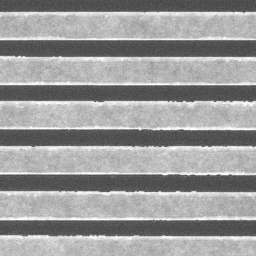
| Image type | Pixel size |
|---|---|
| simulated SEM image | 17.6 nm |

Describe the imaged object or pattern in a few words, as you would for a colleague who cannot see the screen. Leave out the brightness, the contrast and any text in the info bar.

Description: lines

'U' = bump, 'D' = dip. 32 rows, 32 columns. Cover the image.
DDDDDDDDDDDDDDDDDDDDDDDDDDDDDDDD
DDDDDDDDDDDDDDDDDDDDDDDDDDDDDDDD
UUUUUUUUUUUUUUUUUUUUUUUUUUUUUUUU
UUUUUUUUUUUUUUUUUUUUUUUUUUUUUUUU
UUUUUUUUUUUUUUUUUUUUUUUUUUUUUUUU
DDDDDDDDDDDDDDDDDDDDDDDDDDDDDDDD
DDDDDDDDDDDDDDDDDDDDDDDDDDDDDDDD
UUUUUUUUUUUUUUUUUUUUUUUUUUUUUUUU
UUUUUUUUUUUUUUUUUUUUUUUUUUUUUUUU
UUUUUUUUUUUUUUUUUUUUUUUUUUUUUUUU
DDDDDDDDDDUUUUUUUUUUUUUUUUUUUUUU
DDDDDDDDDDDDDDDDDDDDDDDDDDDDDDDD
DDDDDDDDDDDDDDDDDDDDDDDDDDDDDDDD
UUUUUUUUUUUUUUUUUUUUUUUUUUUUUUUU
UUUUUUUUUUUUUUUUUUUUUUUUUUUUUUUU
UUUUUUUUUUUUUUUUUUUUUUUUUUUUUUUU
DDDDDDDDDDDDDDDDDDDDDDDDDDDDDDDD
DDDDDDDDDDDDDDDDDDDDDDDDDDDDDDDD
UUUUDDUUUUUUUUUUUDDDDUUUUUUUUUUU
UUUUUUUUUUUUUUUUUUUUUUUUUUUUUUUU
UUUUUUUUUUUUUUUUUUUUUUUUUUUUUUUU
UUUUUUUUUUUUUUUUUUUUUUUUUUUUUUUU
DDDDDDDDDDDDDDDDDDDDDDDDDDDDDDDD
DDDDDDDDDDDDDDDDDDDDDDDDDDDDDDDD
UUUUUUUUUUUUUUUUUUUUUUUUUUUUUUUU
UUUUUUUUUUUUUUUUUUUUUUUUUUUUUUUU
UUUUUUUUUUUUUUUUUUUUUUUUUUUUUUUU
DDDDDDDDDDDDDDDDDDDDDDDDDDDDDDDD
DDDDDDDDDDDDDDDDDDDDDDDDDDDDDDDD
DDDDDDDDDDDDDDDDDDDDDDDDDDDDDDDD
UUUUUUUUUUUUUUUUUUUUUUUUUUUUUUUU
UUUUUUUUUUUUUUUUUUUUUUUUUUUUUUUU